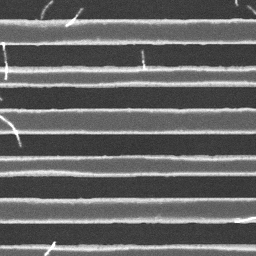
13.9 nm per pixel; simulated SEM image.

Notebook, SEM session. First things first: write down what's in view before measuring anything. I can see lines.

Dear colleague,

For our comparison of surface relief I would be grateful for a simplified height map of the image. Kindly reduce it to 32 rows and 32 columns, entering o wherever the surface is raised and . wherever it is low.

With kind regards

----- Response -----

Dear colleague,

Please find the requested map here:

................................
................................
o.......oooooooooooooooooooooooo
oooooooooooooooooooooooooooooooo
oooooooooooooooooooooooooooooooo
oooooooooooo.ooo...o............
................................
................................
.................oo.............
oooooooooooooooooooooooooooooooo
oooooooooooooooooooooooooooooooo
................................
................................
................................
oooooooooooooooooooooooooooooooo
oooooooooooooooooooooooooooooooo
oooooooooooooooooooooooooooooooo
................................
................................
................................
oooooooooooooooooooooooooooooooo
oooooooooooooooooooooooooooooooo
................................
................................
................................
oooooooooooooooooooooooooooooooo
oooooooooooooooooooooooooooooooo
oooooooooooooooooooooooooooooooo
................................
................................
................................
oooooooooooooooooooooooooooooooo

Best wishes